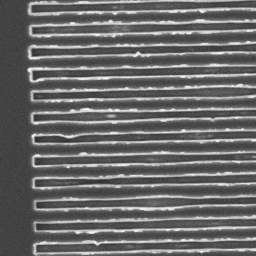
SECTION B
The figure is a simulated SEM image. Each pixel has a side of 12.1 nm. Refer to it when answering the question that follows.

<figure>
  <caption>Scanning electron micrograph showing parallel lines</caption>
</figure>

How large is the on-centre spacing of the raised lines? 264 nanometers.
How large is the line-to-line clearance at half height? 103 nanometers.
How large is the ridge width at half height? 160 nm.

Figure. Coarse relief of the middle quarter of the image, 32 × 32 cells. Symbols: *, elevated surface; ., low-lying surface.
********************************
................................
................................
**....**************************
********************************
********************************
*************...................
................................
..................*..........***
********************************
********************************
********************************
................................
................................
*..**.....**********************
********************************
********************************
******..........................
................................
............*****...************
********************************
********************************
******************..............
................................
................................
********************************
********************************
********************************
...********.....................
................................
......**************************
********************************